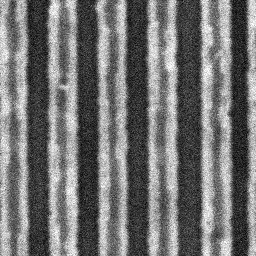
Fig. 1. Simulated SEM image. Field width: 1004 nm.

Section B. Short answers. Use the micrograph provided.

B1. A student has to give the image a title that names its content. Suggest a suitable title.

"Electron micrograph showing parallel lines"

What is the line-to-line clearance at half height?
0.115 µm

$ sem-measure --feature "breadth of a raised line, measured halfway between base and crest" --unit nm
81.9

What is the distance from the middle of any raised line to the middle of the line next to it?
50.9 px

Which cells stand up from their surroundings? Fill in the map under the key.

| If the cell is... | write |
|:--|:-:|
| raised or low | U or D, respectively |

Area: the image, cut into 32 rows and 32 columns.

UUUDDDUUUDDDDUUDDDDUUDDDDDUUDDDU
UUUDDDUUUDDDDUUDDDDUUDDDDDUUDDDU
UUUDDDUUUDDDDUUDDDDUUDDDDDUUDDDU
DUUDDDUUUDDDDUUDDDDUUDDDDDUUDDDU
UUUDDDDUUDDDDUUDDDDUUUDDDDUUDDDD
UUUDDDDUUDDDDUUDDDDUUUDDDDUUDDDU
UUUDDDDUUDDDDUUDDDDUUDDDDDUUDDDD
UUUDDDDUUDDDDUUDDDDUUDDDDDUUDDDD
UUUDDDDUUDDDDUUDDDDUUDDDDDUUDDDD
UUUDDDDUUDDDDUUDDDDUUDDDDDUUDDDU
UUUDDDDUUDDDDUUDDDDUUDDDDDUUDDDU
UUUDDDDUUDDDDUUDDDDUUDDDDDUUDDDU
UUUDDDDUUDDDDUUDDDDUUDDDDDUUUDDU
UUUDDDDUUDDDDUUDDDDUUUDDDDUUDDDD
UUUDDDDUUDDDDUUDDDDUUDDDDDUUDDDD
UUUDDDDUUDDDDUUDDDDUUUDDDDUUDDDU
UUUDDDDUUDDDDUUDDDDUUDDDDDUUDDDD
UUUDDDDUUDDDDUUDDDDUUDDDDDUUUDDD
UUUDDDDUUDDDDUUDDDDUUUDDDDUUUDDU
DUUDDDDUUDDDDUUDDDDUUUDDDDUUDDDD
DUUDDDUUUDDDDUUDDDDUUUDDDDUUUDDD
DUUDDDUUUDDDDUUDDDDUUUDDDDUUDDDD
DUUDDDDUUDDDDUUDDDDUUUDDDDUUDDDD
DUUDDDDUUDDDDUUDDDDUUUDDDDUUDDDD
DUUDDDDUUDDDDUUDDDDUUDDDDDUUDDDD
DUUDDDDUUDDDDUUDDDDUUDDDDDUUDDDD
DUUDDDDUUDDDDUUDDDDUUUDDDUUUDDDD
DUUDDDDUUDDDDUUDDDDUUUDDDDUUDDDD
DUUDDDDUUDDDDUUDDDDUUDDDDDUUDDDD
DUUDDDDUUDDDDUUDDDDUUUDDDDUUDDDD
DUUDDDDUUDDDDUUDDDDUUUDDDDUUDDDD
DUUDDDDUUDDDDUUDDDDUUUDDDDUUUDDD